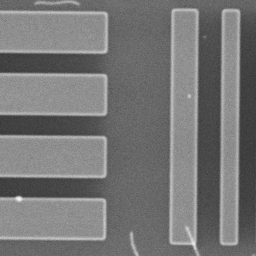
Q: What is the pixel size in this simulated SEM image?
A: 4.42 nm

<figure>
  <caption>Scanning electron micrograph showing groups of lines, slits or small figures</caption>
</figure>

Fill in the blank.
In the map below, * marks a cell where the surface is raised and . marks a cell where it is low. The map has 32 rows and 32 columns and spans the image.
................................
***********...........***...**..
*************........****...**..
*************........****...**..
*************........****...**..
*************........****...**..
*************........****...**..
.....................****...**..
.....................****...**..
*************........****...**..
*************........****...**..
*************........****...**..
*************........****...**..
*************........****...**..
.....................****...**..
.....................****...**..
.....................****...**..
*************........****...**..
*************........****...**..
*************........****...**..
*************........****...**..
*************........****...**..
.....................****...**..
.....................****...**..
.....................****...**..
*************........***....**..
*************........***....**..
*************........***....**..
*************........***....**..
*************........***....**..
............................*...
................................